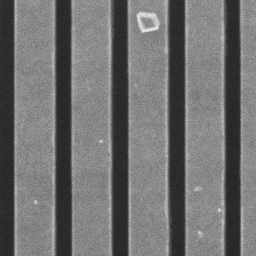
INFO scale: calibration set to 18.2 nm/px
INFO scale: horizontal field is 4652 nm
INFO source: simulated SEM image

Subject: lines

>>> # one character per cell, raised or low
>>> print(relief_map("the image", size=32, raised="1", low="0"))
00111110011111001111100111110011
00111110011111001111100111110011
00111110011111001111100111110011
00111110011111001111100111110011
00111110011111001111100111110011
00111110011111001111100111110011
00111110011111001111100111110011
00111110011111001111100111110011
00111110011111001111100111110011
00111110011111001111100111110011
00111110011111001111100111110011
00111110011111001111100111110011
00111110011111001111100111110011
00111110011111001111100111110011
00111110011111001111100111110011
00111110011111001111100111110011
00111110011111001111100111110011
00111110011111001111100111110011
00111110011111001111100111110011
00111110011111001111100111110011
00111110011111001111100111110011
00111110011111001111100111110011
00111110011111001111100111110011
00111110011111001111100111110011
00111110011111001111100111110011
00111110011111001111100111110011
00111110011111001111100111110011
00111110011111001111100111110011
00111110011111001111100111110011
00111110011111001111100111110011
00111110011111001111100111110011
00111110011111001111100111110011